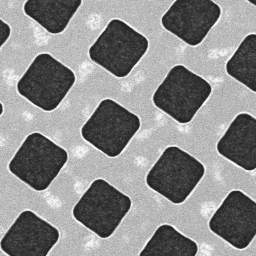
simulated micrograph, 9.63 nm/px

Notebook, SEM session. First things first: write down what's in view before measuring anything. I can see holes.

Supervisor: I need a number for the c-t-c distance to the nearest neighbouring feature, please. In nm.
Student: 760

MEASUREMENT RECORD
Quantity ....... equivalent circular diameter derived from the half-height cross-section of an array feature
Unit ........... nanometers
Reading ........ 504